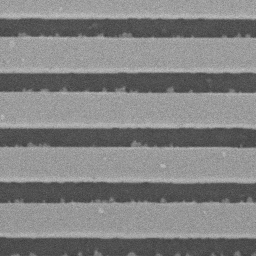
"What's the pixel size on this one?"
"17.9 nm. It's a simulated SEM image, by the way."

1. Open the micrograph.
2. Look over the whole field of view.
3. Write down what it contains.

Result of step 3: lines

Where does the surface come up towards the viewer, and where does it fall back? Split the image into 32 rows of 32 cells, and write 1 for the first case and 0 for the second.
11111111111111111111111111111111
11111111111111111111111111111111
00000000000000000000000000000000
00000000000000000000000000000000
00000000000000000000000000000000
11111111111111111111111111111111
11111111111111111111111111111111
11111111111111111111111111111111
11111111111111111111111111111111
00000000000000000000000000000000
00000000000000000000000000000000
00000000000000000000000000000000
11111111111111111111111111111111
11111111111111111111111111111111
11111111111111111111111111111111
11111111111111111111111111111111
00000000000000000000000000000000
00000000000000000000000000000000
11111111111111111111111111111111
11111111111111111111111111111111
11111111111111111111111111111111
11111111111111111111111111111111
11111111111111111111111111111111
00000000000000000000000000000000
00000000000000000000000000000000
11111111111111111111111111111111
11111111111111111111111111111111
11111111111111111111111111111111
11111111111111111111111111111111
11111110010111111111111111111111
00000000000000000000000000000000
00000000000000000000000000000000